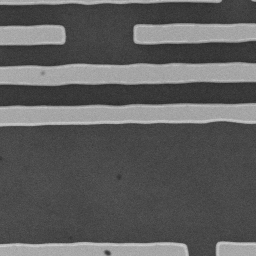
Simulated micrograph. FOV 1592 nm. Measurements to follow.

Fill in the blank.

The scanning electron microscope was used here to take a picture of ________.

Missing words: groups of lines, slits or small figures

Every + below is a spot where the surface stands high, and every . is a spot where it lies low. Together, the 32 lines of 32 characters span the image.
++++............................
................................
................................
++++++++.........+++++++++++++++
++++++++.........+++++++++++++++
................................
................................
................................
++++++++++++++++++++++++++++++++
++++++++++++++++++++++++++++++++
...+++++........................
................................
................................
++++++++++++++++++++++++++++++++
++++++++++++++++++++++++++++++++
+++++...........................
................................
................................
................................
................................
................................
................................
................................
................................
................................
................................
................................
................................
................................
................................
.........+++++..+.+++++....+++++
+++++++++++++++++++++++....+++++